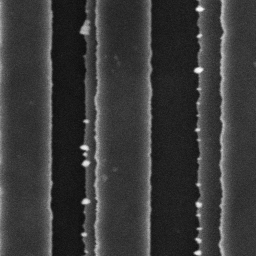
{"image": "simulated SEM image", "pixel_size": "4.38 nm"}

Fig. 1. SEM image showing lines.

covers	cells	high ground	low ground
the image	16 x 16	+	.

+++..++++...++++
+++..++++...++++
+++..++++...++++
+++..++++...++++
+++..++++...++++
+++..++++...++++
+++..++++...++++
+++..++++...++++
+++..++++...++++
+++..++++...++++
+++..++++...++++
+++..++++...++++
+++..++++...++++
+++..++++...++++
+++..++++...++++
+++..++++...++++